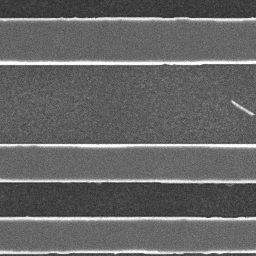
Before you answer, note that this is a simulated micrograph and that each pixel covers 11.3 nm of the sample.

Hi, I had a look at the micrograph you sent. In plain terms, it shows lines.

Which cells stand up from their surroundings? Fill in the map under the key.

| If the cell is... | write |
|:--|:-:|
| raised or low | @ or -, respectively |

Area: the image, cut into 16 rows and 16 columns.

----------------
@@@@@@@@@@@@@@@@
@@@@@@@@@@@@@@@@
@@@@@@@@@@@@@@@@
----------------
----------------
----------------
----------------
----------------
@@@@@@@@@@@@@@@@
@@@@@@@@@@@@@@@@
----------------
----------------
----------------
@@@@@@@@@@@@@@@@
@@@@@@@@@@@@@@@@